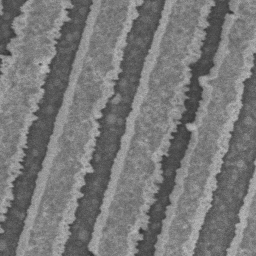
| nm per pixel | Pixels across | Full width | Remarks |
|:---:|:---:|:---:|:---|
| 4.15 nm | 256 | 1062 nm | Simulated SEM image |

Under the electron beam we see one or a few lines or trenches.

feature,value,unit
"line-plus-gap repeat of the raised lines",65.2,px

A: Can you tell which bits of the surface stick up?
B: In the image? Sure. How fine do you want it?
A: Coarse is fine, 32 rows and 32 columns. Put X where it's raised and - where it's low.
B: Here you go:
---XXXXX----XXXXX----XXXXX---XXX
---XXXXX----XXXXX----XXXXX---XXX
---XXXXX---XXXXX----XXXXXX---XXX
--XXXXXX---XXXXX----XXXXX---XXXX
--XXXXX----XXXXX----XXXXX---XXXX
--XXXXX---XXXXX----XXXXXX---XXXX
-XXXXXX---XXXXX----XXXXX---XXXX-
-XXXXX----XXXXX----XXXXX---XXXX-
-XXXXX----XXXXX----XXXX----XXXX-
XXXXX----XXXXX----XXXXX---XXXXX-
XXXXX----XXXXX----XXXXX--XXXXX--
XXXXX----XXXX-----XXXXX---XXXX--
XXXX----XXXXX----XXXXXX---XXXX--
XXXXX---XXXX-----XXXXX---XXXX---
XXXX----XXXX-----XXXXX---XXXX---
XXXX---XXXXX----XXXXXX--XXXXX---
XXX----XXXXX----XXXXX---XXXX----
XXX----XXXXX----XXXXX---XXXX----
XX----XXXXX----XXXXX----XXXX----
XXX---XXXXX----XXXXX---XXXXX----
XX----XXXXX----XXXXX---XXXX-----
XX---XXXXX----XXXXXX---XXXX-----
XX---XXXXX----XXXXX---XXXX------
X----XXXXX----XXXXX---XXXX-----X
X----XXXXX---XXXXXX---XXXX-----X
----XXXXX----XXXXX----XXXX-----X
X---XXXXX----XXXXX---XXXX-----XX
----XXXXX----XXXXX---XXXX-----XX
---XXXXX----XXXXX----XXXX-----XX
---XXXXX----XXXXX---XXXXX-----XX
---XXXXX----XXXXX---XXXX-----XXX
---XXXX-----XXXXX---XXXX-----XXX